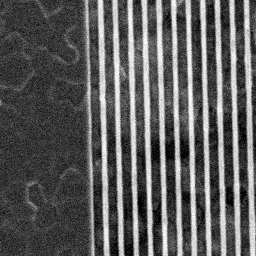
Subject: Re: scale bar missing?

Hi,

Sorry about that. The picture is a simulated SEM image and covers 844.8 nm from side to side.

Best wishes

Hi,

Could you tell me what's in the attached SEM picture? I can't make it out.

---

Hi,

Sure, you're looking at parallel lines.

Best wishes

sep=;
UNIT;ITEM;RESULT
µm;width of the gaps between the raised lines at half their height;0.0334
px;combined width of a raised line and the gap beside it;14.6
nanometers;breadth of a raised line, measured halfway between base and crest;14.4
